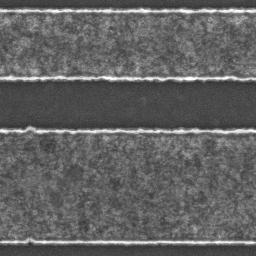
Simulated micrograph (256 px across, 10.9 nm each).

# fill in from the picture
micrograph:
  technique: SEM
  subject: one or a few lines or trenches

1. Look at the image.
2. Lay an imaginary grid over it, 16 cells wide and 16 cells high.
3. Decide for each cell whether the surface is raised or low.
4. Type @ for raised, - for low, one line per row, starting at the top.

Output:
----------------
@@@@@@@@@@@@@@@@
@@@@@@@@@@@@@@@@
@@@@@@@@@@@@@@@@
@@@@@@@@@@@@@@@@
----------------
----------------
----------------
@@@@@@@@@@@@@@@@
@@@@@@@@@@@@@@@@
@@@@@@@@@@@@@@@@
@@@@@@@@@@@@@@@@
@@@@@@@@@@@@@@@@
@@@@@@@@@@@@@@@@
@@@@@@@@@@@@@@@@
----------------